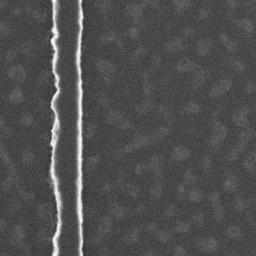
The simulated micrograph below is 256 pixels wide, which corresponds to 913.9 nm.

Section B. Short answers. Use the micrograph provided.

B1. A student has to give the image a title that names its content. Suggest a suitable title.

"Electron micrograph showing one or a few lines or trenches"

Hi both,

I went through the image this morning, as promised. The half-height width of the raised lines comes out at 93.8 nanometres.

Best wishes